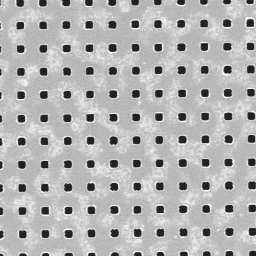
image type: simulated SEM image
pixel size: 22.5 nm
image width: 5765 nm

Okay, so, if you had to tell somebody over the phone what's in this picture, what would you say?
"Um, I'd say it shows a regular array of holes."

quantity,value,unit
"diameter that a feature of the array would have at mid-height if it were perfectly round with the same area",197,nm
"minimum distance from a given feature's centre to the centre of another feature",508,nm